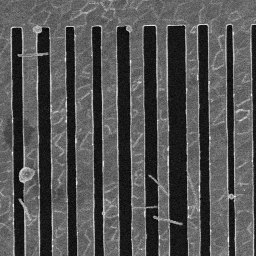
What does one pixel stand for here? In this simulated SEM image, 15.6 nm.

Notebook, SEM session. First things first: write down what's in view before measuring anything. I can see groups of lines, slits or small figures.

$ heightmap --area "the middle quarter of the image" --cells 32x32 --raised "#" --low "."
...####..####....###...###.....#
...####...###....###...###.....#
...####...###....###...###.....#
...####...###....###...###.....#
...####...###....###...###.....#
...####...###....###...###.....#
#..####...###....###...###.....#
#..####...###....###...###.....#
#..####...###....###...###.....#
#..####...###....###...###.....#
#..####...###....###...###.....#
#..####...###....###...###.....#
#..####...###....###...###.....#
#..####...###....###...###.....#
#..####...###....###...###.....#
#..####...###....###...###.....#
#..####...###....###...###.....#
#..####...###....###...###.....#
#..####...###....###....##.....#
#..####...###....###...###.....#
#..####...###....###...###.....#
#..####...###....###...###.....#
#..####...###....###...###.....#
#..####...###....###....##.....#
#..####...###....###....##.....#
#..####...###....###...###.....#
#..####...###....###...###.....#
#..####...####...###....##.....#
#..####...####...###....##.....#
#..####...###....###...###.....#
#..####...####...###....##.....#
#..####...####...###....##.....#